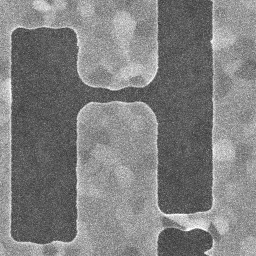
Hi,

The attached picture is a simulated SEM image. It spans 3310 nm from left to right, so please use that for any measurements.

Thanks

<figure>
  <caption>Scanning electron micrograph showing one or a few lines or trenches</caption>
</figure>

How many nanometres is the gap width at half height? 760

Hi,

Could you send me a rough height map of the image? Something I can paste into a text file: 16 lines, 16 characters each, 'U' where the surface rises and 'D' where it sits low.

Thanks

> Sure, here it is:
UUUUUUUUUUDDDUUU
UUUUUUUUUUDDDUUU
UDDDDUUUUUDDDUUU
UDDDDUUUUUDDDUUU
UDDDDUUUUUDDDUUU
UDDDDDUUDDDDDUUU
UDDDDDUUUDDDDUUU
UDDDDUUUUUDDDUUU
UDDDDUUUUUDDDUUU
UDDDDUUUUUDDDUUU
UDDDDUUUUUDDDUUU
UDDDDUUUUUDDDUUU
UDDDDUUUUUDDDUUU
UDDDDUUUUUUUUUUU
UDDDDUUUUUDDDUUU
UUUUUUUUUUDDDUUU